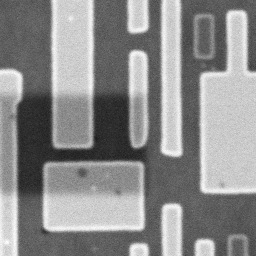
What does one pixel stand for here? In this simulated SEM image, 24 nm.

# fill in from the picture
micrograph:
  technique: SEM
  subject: wiring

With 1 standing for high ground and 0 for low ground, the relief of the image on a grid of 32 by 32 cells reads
00000001111000001100110000000000
00000001111000001100110000000100
00000001111000001100110011100110
00000001111000001100110011100110
00000001111000000000110011100110
00000001111000000000110011100110
00000001111000000100110011100110
00000001111000001100110000000110
00000001111000001100110000001110
11100001111000001100110001111111
11100001111000001100110001111111
11100001111000001100110001111111
11000001111000001100110001111111
11000001111000001100110001111111
11000001111000001100110001111111
11000001111000001100110001111111
11000001111000001100110001111111
11000001111000001100111001111111
11000000000000000000111001111111
11000000000000000000000001111111
11000011111111111100000001111111
11000011111111111100000001111111
11000011111111111100000001111111
11000011111111111100000001111111
11000011111111111100000000000000
11000011111111111100000000000000
11000011111111111100111000000000
11000011111111111100111000000000
11000011111111111100111000000000
11000000000000000000111000000100
11000000000000000000111001100110
11000000000000001100011001100110